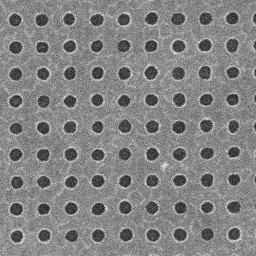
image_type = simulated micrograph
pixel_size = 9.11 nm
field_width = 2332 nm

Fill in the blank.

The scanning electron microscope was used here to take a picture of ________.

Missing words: a regular array of holes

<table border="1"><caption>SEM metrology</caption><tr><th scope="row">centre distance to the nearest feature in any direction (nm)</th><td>241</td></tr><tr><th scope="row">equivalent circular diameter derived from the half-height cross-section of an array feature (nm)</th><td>119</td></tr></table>